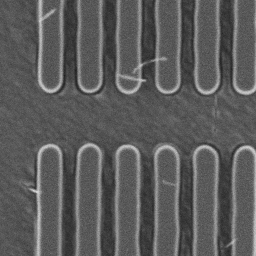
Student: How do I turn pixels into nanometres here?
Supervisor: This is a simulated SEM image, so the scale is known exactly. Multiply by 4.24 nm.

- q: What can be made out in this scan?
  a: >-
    groups of lines, slits or small figures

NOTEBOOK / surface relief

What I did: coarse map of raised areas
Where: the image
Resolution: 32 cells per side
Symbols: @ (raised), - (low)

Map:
-----@@@--@@@--@@@--@@---@@--@@@
-----@@@--@@@--@@---@@@-@@@--@@@
-----@@@--@@@--@@@--@@@-@@@--@@@
-----@@@--@@@--@@@--@@@-@@@--@@@
-----@@@--@@@--@@---@@@-@@@--@@@
-----@@@--@@@--@@---@@--@@@--@@@
-----@@@--@@@--@@---@@--@@@--@@@
-----@@@--@@@--@@--@@@--@@@--@@@
-----@@@--@@@--@@@--@@--@@@--@@@
-----@@@--@@@--@@@--@@--@@@--@@@
-----@@@--@@@--@@@--@@---@@--@@@
----------------@---@@---@@---@-
--------------------------------
--------------------------------
--------------------------------
--------------------------------
--------------------------------
--------------------------------
-----@@---@@---@@---@@---@----@-
-----@@@--@@@--@@--@@@--@@@--@@@
-----@@@--@@@--@@--@@@--@@@--@@@
-----@@@--@@@--@@--@@@--@@@--@@@
-----@@@--@@@--@@---@@--@@@--@@@
-----@@@--@@@--@@---@@--@@@--@@@
-----@@@--@@@-@@@---@@--@@@--@@@
-----@@@--@@@-@@@---@@--@@@--@@@
-----@@@--@@@-@@@---@@--@@@--@@@
-----@@@--@@---@@---@@--@@@--@@@
-----@@@--@@---@@--@@@--@@@--@@@
-----@@@--@@---@@--@@@--@@@--@@@
-----@@@--@@---@@--@@@--@@@--@@@
-----@@@--@@--@@@--@@@--@@@--@@@